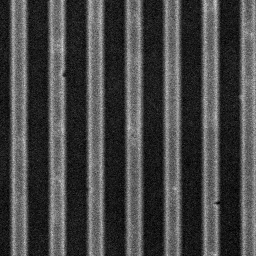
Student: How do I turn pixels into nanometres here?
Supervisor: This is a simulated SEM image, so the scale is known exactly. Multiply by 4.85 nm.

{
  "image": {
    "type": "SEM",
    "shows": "parallel lines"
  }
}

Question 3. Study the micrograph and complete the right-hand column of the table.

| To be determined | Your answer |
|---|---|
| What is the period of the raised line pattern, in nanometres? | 186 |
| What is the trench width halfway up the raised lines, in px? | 22.8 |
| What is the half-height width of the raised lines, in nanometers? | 73.4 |